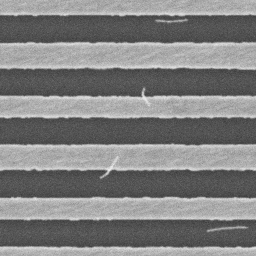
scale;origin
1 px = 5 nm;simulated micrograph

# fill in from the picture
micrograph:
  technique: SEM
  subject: lines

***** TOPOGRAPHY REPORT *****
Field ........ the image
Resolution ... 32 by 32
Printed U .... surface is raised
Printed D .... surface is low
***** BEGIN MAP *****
UUUUUUUUUUUUUUUUUUUUUUUUUUUUUUUU
UUUUUUUUUUUUUUUUUUUUUUUUUUUUUUUU
DDDDDDDDDDDDDDDDDDDDDDDDDDDDDDDD
DDDDDDDDDDDDDDDDDDDDDDDDDDDDDDDD
DDDDDDDDDDDDDDDDDDDDDDDDDDDDDDDD
UUUUUUUUUUUUUUUUUUUUUUUUUUUUUUUU
UUUUUUUUUUUUUUUUUUUUUUUUUUUUUUUU
UUUUUUUUUUUUUUUUUUUUUUUUUUUUUUUU
UUUUUUUUUUDDUDDUUUUDUUDUUUUUUUUU
DDDDDDDDDDDDDDDDDDDDDDDDDDDDDDDD
DDDDDDDDDDDDDDDDDDDDDDDDDDDDDDDD
DDDDDDDDDDDDDDDDDDDDDDDDDDDDDDDD
UUUUUUUUUUUUUUUUUUUUUUUUUUUUUUUU
UUUUUUUUUUUUUUUUUUUUUUUUUUUUUUUU
UUUUUUUUUUUUUUUUUUUUUUUUUUUUUUUU
DDDDDDDDDDDDDDDDDDDDDDDDDDDDDDDD
DDDDDDDDDDDDDDDDDDDDDDDDDDDDDDDD
DDDDDDDDDDDDDDDDDDDDDDDDDDDDDDDD
UUUUUUUUUUUUUUUUUUUUUUUUUUUUUUUU
UUUUUUUUUUUUUUUUUUUUUUUUUUUUUUUU
UUUUUUUUUUUUUUUUUUUUUUUUUUUUUUUU
DDDDDDDDDDDDDDDDDDDDDDDDDDDDDDDD
DDDDDDDDDDDDDDDDDDDDDDDDDDDDDDDD
DDDDDDDDDDDDDDDDDDDDDDDDDDDDDDDD
DDDDDDDDDDDDDDDDDDDDDDDDDDDDDDDD
UUUUUUUUUUUUUUUUUUUUUUUUUUUUUUUU
UUUUUUUUUUUUUUUUUUUUUUUUUUUUUUUU
DDDDDDDDDDDDDDDDDDDDDDDDDDDDDDDD
DDDDDDDDDDDDDDDDDDDDDDDDDDDDDDDD
DDDDDDDDDDDDDDDDDDDDDDDDDDDDDDDD
DDDDDDDDDDDDDDDDDDDDDDDDDDDDDDDD
UUUUUUUUUUUUUUUUUUUUUUUUUUUUUUUU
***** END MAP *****